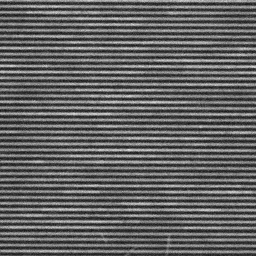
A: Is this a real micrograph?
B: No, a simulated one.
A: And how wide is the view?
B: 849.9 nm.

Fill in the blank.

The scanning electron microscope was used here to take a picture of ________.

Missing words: parallel lines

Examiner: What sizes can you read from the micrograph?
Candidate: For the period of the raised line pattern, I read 0.0198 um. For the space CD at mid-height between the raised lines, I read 12.9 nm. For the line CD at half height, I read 6.6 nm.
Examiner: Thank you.